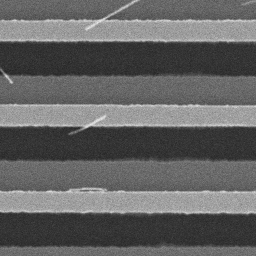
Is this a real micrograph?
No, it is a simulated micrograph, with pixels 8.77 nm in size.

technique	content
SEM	lines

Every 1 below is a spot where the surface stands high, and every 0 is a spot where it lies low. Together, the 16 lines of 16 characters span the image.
1111111111111111
1111111111111111
1111111111111111
0000000000000000
0000000000000000
1111111111111111
1111111111111111
1111111111111111
0000000000000000
0000000000000000
1111111111111111
1111111111111111
1111111111111111
0000000000000000
0000000000000000
1111111111111111